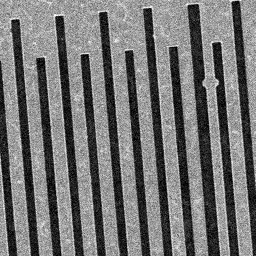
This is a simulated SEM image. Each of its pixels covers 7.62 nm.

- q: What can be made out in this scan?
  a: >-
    parallel lines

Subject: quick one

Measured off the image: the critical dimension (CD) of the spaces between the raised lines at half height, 75 nanometers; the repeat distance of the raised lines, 168 nm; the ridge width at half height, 0.0978 microns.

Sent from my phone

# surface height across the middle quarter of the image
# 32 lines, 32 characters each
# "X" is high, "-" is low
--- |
-XXX---XXX--XXX---XXX--XXX---XXX
-XXX---XXX--XXX---XXX---XX---XXX
-XXX---XXX--XXXX--XXX---XX---XXX
-XXX---XXX---XXX--XXX---XXX--XXX
-XXXX--XXX---XXX--XXX---XXX--XXX
--XXX--XXX---XXX--XXX---XXX--XXX
--XXX--XXX---XXX--XXX---XXX--XXX
--XXX--XXX---XXX--XXX---XXX---XX
--XXX--XXX---XXX--XXX---XXX---XX
--XXX--XXX---XXX---XXX--XXX---XX
--XXX--XXX---XXX---XXX--XXX---XX
--XXX---XXX--XXX---XXX--XXX---XX
--XXX---XXX--XXX---XXX--XXX---XX
--XXX---XXX--XXX---XXX--XXX---XX
--XXX---XXX--XXXX--XXX--XXX---XX
--XXX---XXX---XXX--XXX--XXXX--XX
---XXX--XXX---XXX--XXX---XXX--XX
---XXX--XXX---XXX--XXX---XXX--XX
---XXX--XXX---XXX--XXX---XXX--XX
---XXX--XXX---XXX--XXX---XXX---X
---XXX--XXX---XXX--XXX---XXX---X
---XXX--XXX---XXX---XXX--XXX---X
---XXX--XXXX--XXX---XXX--XXX---X
---XXX---XXX--XXX---XXX--XXX---X
X--XXX---XXX--XXX---XXX--XXX---X
X--XXX---XXX--XXX---XXX--XXX---X
X--XXX---XXX---XXX--XXX--XXX---X
X--XXX---XXX---XXX--XXX---XXX--X
X---XXX--XXX---XXX--XXX---XXX--X
X---XXX--XXX---XXX--XXX---XXX--X
X---XXX--XXX---XXX--XXX---XXX--X
X---XXX--XXX---XXX--XXX---XXX---